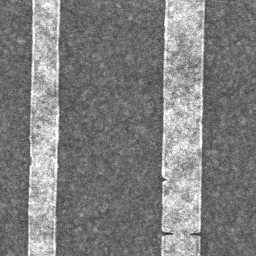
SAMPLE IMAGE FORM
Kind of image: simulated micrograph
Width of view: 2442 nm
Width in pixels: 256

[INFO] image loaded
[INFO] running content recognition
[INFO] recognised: one or a few lines or trenches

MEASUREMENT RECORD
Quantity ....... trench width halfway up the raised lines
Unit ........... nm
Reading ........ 1030